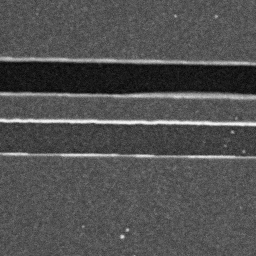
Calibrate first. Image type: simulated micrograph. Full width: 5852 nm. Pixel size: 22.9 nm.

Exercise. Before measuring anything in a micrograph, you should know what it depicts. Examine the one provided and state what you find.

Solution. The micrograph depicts lines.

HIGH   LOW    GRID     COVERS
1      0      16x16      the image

1111111111111111
1111111111111111
1111111111111111
1111111111111111
0000000000000000
0000000000000000
1111111111111111
1111111111111111
1111111111111111
1111111111111111
1111111111111111
1111111111111111
1111111111111111
1111111111111111
1111111111111111
1111111111111111